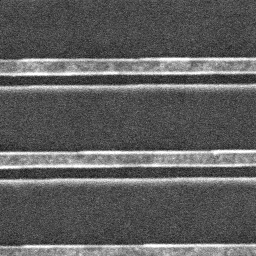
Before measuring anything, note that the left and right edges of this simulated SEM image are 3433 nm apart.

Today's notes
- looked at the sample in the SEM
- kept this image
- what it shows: lines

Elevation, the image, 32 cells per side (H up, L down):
LLLLLLLLLLLLLLLLLLLLLLLLLLLLLLLL
LLLLLLLLLLLLLLLLLLLLLLLLLLLLLLLL
LLLLLLLLLLLLLLLLLLLLLLLLLLLLLLLL
LLLLLLLLLLLLLLLLLLLLLLLLLLLLLLLL
LLLLLLLLLLLLLLLLLLLLLLLLLLLLLLLL
LLLLLLLLLLLLLLLLLLLLLLLLLLLLLLLL
LLLLLLLLLLLLLLLLLLLLLLLLLLLLLLLL
LLLHHHHHHHHHHHHHHHHHHHHHHHHHHHHH
HHHHHHHHHHHHHHHHHHHHHHHHHHHHHHHH
LLLLLLLLLLLLLLLLLLLLLLLLLLLLLLLL
LLLLLLLLLLLLLLLLLLLLLLLLLLLLLLLL
LLLLLLLLLLLLLLLLLLLLLLLLLLLLLLLL
LLLLLLLLLLLLLLLLLLLLLLLLLLLLLLLL
LLLLLLLLLLLLLLLLLLLLLLLLLLLLLLLL
LLLLLLLLLLLLLLLLLLLLLLLLLLLLLLLL
LLLLLLLLLLLLLLLLLLLLLLLLLLLLLLLL
LLLLLLLLLLLLLLLLLLLLLLLLLLLLLLLL
LLLLLLLLLLLLLLLLLLLLLLLLLLLLLLLL
LLLLLLLLLLLLLLLLLLLLLLLLLLLLLLLL
HHHHHHHHHHHHHHHHHHHHHHHHHHHHHHHH
HHHHHHHHHHHHHHHHHHHHHHHHHHHHHHHH
LLLLLLLLLLLLLLLLLLLLLLLLLLLLLLLL
LLLLLLLLLLLLLLLLLLLLLLLLLLLLLLLL
LLLLLLLLLLLLLLLLLLLLLLLLLLLLLLLL
LLLLLLLLLLLLLLLLLLLLLLLLLLLLLLLL
LLLLLLLLLLLLLLLLLLLLLLLLLLLLLLLL
LLLLLLLLLLLLLLLLLLLLLLLLLLLLLLLL
LLLLLLLLLLLLLLLLLLLLLLLLLLLLLLLL
LLLLLLLLLLLLLLLLLLLLLLLLLLLLLLLL
LLLLLLLLLLLLLLLLLLLLLLLLLLLLLLLL
LLLLLLLLLLLLLLLLLLLLLLLLLLLLLLLL
HHHHHHHHHHHHHHHHHHHHHHHHHHHHHHHH